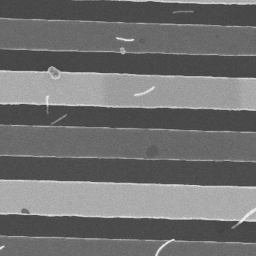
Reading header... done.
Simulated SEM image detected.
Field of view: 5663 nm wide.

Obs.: lines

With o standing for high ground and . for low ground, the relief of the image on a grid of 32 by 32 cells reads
............................oooo
................................
oooooo..........................
oooooooooooooooooooooooooooooooo
oooooooooooooooooooooooooooooooo
oooooooooooooooooooooooooooooooo
..............oooooooooooooooooo
................................
......o.........................
ooooooooooooooooooooooo.........
oooooooooooooooooooooooooooooooo
oooooooooooooooooooooooooooooooo
oooooooooooooooooooooooooooooooo
.......................ooooooooo
................................
................................
ooooooooooooooooooooooooooooo...
oooooooooooooooooooooooooooooooo
oooooooooooooooooooooooooooooooo
....oooooooooooooooooooooooooooo
................................
................................
................................
oooooooooooooooooooooooooooooooo
oooooooooooooooooooooooooooooooo
oooooooooooooooooooooooooooooooo
oooooooooooooooooooooooooooooooo
...........................ooooo
................................
o...............................
oooooooooooooooooooooooooooooooo
oooooooooooooooooooooooooooooooo